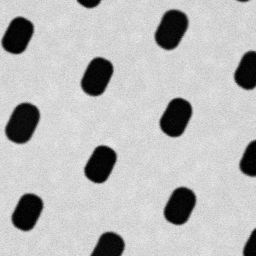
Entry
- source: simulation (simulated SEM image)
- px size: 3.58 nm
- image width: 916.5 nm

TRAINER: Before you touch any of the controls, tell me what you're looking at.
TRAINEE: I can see a regular array of holes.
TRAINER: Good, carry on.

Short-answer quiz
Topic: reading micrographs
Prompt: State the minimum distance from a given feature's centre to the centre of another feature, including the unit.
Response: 314 nm